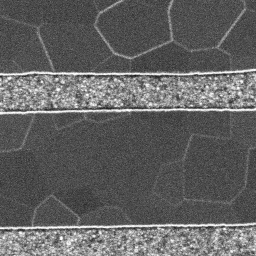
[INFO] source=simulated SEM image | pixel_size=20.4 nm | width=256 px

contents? one or a few lines or trenches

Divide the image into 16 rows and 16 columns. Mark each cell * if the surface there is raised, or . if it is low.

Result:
****************
****************
****************
****************
***************.
................
................
****************
****************
****************
****************
****************
****************
****************
................
................